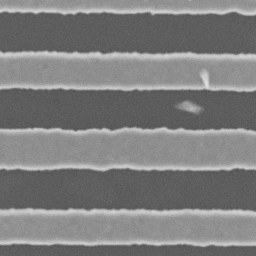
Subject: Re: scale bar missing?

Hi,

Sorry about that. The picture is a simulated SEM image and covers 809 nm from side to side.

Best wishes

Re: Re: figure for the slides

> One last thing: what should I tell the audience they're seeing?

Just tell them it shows lines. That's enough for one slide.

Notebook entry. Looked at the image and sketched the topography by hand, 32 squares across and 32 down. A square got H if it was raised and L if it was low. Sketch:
HHHHHHHHHHHHHHHHHHHHHHHHHHHHHHHH
LHHHHHHHHHHHHHHHHHHHHHHHHHHHHHHH
LLLLLLLLLLLLLLLLLLLLLLLLLLLLLLLL
LLLLLLLLLLLLLLLLLLLLLLLLLLLLLLLL
LLLLLLLLLLLLLLLLLLLLLLLLLLLLLLLL
LLLLLLLLLLLLLLLLLLLLLLLLLLLLLLLL
LLLLLLLLLLLLLLLLLLLLLLLLLLLLLLLL
HHHHHHHHHHHHHHHHHHHHHHHHHHHHHHHH
HHHHHHHHHHHHHHHHHHHHHHHHHHHHHHHH
HHHHHHHHHHHHHHHHHHHHHHHHHHHHHHHH
HHHHHHHHHHHHHHHHHHHHHHHHHHHHHHHH
LLLLLLLLLLLLLLLLLLLLLLLLLLLLLLLL
LLLLLLLLLLLLLLLLLLLLLLLLLLLLLLLL
LLLLLLLLLLLLLLLLLLLLLLLLLLLLLLLL
LLLLLLLLLLLLLLLLLLLLLLLLLLLLLLLL
LLLLLLLLLLLLLLLLLLLLLLLLLLLLLLLL
HHHHHHHHHHHHHHHHHHHHHHHHHHHHHHHH
HHHHHHHHHHHHHHHHHHHHHHHHHHHHHHHH
HHHHHHHHHHHHHHHHHHHHHHHHHHHHHHHH
HHHHHHHHHHHHHHHHHHHHHHHHHHHHHHHH
HHHHHHHHHHHHHHHHHHHHHHHHHHHHHHHH
LLLLLLLLLLLLLLLLLLLLLLLLLLLLLLLL
LLLLLLLLLLLLLLLLLLLLLLLLLLLLLLLL
LLLLLLLLLLLLLLLLLLLLLLLLLLLLLLLL
LLLLLLLLLLLLLLLLLLLLLLLLLLLLLLLL
LLLLLLLLLLLLLLLLLLLLLLLLLLLLLLLL
HHHHHHHHHHHHHHHHHHHHHHHHHHHHHHHL
HHHHHHHHHHHHHHHHHHHHHHHHHHHHHHHH
HHHHHHHHHHHHHHHHHHHHHHHHHHHHHHHH
HHHHHHHHHHHHHHHHHHHHHHHHHHHHHHHH
HLLHHHHLHHHHHHHHHHHHHHHHHHHHHHHH
LLLLLLLLLLLLLLLLLLLLLLLLLLLLLLLL